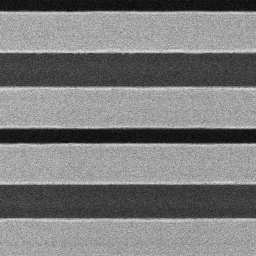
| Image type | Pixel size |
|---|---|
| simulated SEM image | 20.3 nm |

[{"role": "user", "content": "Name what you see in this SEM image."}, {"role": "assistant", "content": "lines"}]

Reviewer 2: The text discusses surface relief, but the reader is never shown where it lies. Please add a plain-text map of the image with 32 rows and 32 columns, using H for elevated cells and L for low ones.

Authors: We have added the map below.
LLLLLLLLLLLLLLLLLLLLLLLLLLLLLLLL
HHHHHHHHHHHHHHHHHHHHHHHHHHHHHHHH
HHHHHHHHHHHHHHHHHHHHHHHHHHHHHHHH
HHHHHHHHHHHHHHHHHHHHHHHHHHHHHHHH
HHHHHHHHHHHHHHHHHHHHHHHHHHHHHHHH
HHHHHHHHHHHHHHHHHHHHHHHHHHHHHHHH
HHHHHHHHHHHHHHHHHHHHHHHHHHHHHHLL
LLLLLLLLLLLLLLLLLLLLLLLLLLLLLLLL
LLLLLLLLLLLLLLLLLLLLLLLLLLLLLLLL
LLLLLLLLLLLLLLLLLLLLLLLLLLLLLLLL
LLLLLLLLLLLLLLLLLLLLLLLLLLLLLLLL
HHHHHHHHHHHHHHHHHHHHHHHHHHHHHHHH
HHHHHHHHHHHHHHHHHHHHHHHHHHHHHHHH
HHHHHHHHHHHHHHHHHHHHHHHHHHHHHHHH
HHHHHHHHHHHHHHHHHHHHHHHHHHHHHHHH
HHHHHHHHHHHHHHHHHHHHHHHHHHHHHHHH
LLLLLLLLLLLLLLLLLLLLLLLLLLLLLLLL
LLLLLLLLLLLLLLLLLLLLLLLLLLLLLLLL
HHHHHHHHHHHHHHHHHHHHHHHHHHHHHHHH
HHHHHHHHHHHHHHHHHHHHHHHHHHHHHHHH
HHHHHHHHHHHHHHHHHHHHHHHHHHHHHHHH
HHHHHHHHHHHHHHHHHHHHHHHHHHHHHHHH
HHHHHHHHHHHHHHHHHHHHHHHHHHHHHHHH
LLLLLLLLLLLLLLLLLLLLLLLLLLLLLLLL
LLLLLLLLLLLLLLLLLLLLLLLLLLLLLLLL
LLLLLLLLLLLLLLLLLLLLLLLLLLLLLLLL
LLLLLLLLLLLLLLLLLLLLLLLLLLLLLLLL
HHHHHHHHHHHHHHHHHHHHHHHHHHHHHHHH
HHHHHHHHHHHHHHHHHHHHHHHHHHHHHHHH
HHHHHHHHHHHHHHHHHHHHHHHHHHHHHHHH
HHHHHHHHHHHHHHHHHHHHHHHHHHHHHHHH
HHHHHHHHHHHHHHHHHHHHHHHHHHHHHHHH